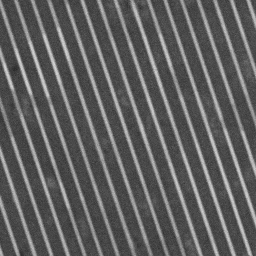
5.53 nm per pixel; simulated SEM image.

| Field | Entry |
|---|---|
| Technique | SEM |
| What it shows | parallel lines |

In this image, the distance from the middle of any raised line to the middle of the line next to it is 0.087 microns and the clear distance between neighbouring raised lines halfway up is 72.8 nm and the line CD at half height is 11.8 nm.